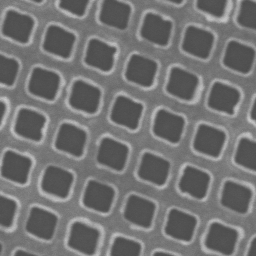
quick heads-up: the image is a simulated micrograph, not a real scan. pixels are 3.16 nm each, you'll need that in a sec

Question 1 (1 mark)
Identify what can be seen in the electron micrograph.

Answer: a regular array of holes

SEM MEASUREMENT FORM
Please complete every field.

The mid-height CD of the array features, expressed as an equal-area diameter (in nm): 100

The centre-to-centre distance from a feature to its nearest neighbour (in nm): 138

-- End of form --